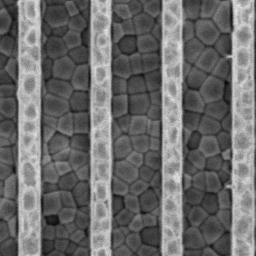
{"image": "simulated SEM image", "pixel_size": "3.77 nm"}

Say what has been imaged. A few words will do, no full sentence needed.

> one or a few lines or trenches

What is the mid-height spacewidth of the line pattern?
52.4 pixels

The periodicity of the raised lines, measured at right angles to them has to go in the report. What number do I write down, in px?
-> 71.2